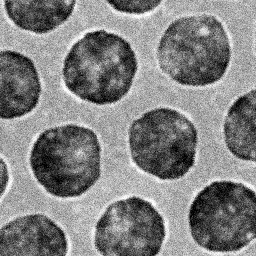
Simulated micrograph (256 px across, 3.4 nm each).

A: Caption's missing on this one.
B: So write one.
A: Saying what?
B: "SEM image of holes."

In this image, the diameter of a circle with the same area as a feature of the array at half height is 252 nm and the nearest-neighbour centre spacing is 0.33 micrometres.